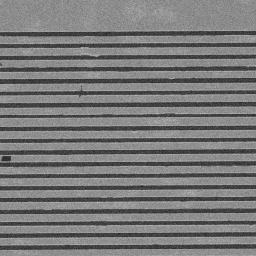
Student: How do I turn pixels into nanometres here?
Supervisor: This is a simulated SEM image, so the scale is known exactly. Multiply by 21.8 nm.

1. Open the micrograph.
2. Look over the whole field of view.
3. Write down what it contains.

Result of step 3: parallel lines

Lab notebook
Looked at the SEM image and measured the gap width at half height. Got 103 nm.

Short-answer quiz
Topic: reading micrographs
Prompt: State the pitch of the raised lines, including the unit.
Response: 258 nm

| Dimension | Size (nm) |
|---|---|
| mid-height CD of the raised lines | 152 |